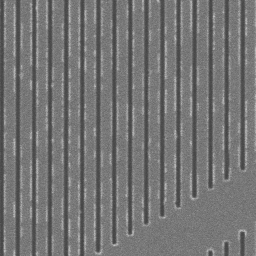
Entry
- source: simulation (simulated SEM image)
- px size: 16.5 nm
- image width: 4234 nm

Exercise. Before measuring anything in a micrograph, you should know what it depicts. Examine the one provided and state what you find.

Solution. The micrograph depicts parallel lines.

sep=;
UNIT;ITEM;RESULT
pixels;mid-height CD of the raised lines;11.7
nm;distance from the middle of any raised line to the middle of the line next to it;266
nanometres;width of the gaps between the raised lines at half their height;66.2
